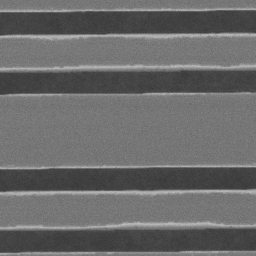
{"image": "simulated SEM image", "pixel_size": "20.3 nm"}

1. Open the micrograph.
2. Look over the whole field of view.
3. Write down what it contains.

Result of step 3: lines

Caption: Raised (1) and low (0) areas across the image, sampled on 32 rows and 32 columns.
11111111111111111111111111111111
00000000000000000000000000000000
00000000000000000000000000000000
00000000000000000000000000000000
01111111111111111111111111111111
11111111111111111111111111111111
11111111111111111111111111111111
11111111111111111111111111111111
11111111111111111111111111111100
00000000000000000000000000000000
00000000000000000000000000000000
00000000000000000000000000000000
11111111111111111111111111111111
11111111111111111111111111111111
11111111111111111111111111111111
11111111111111111111111111111111
11111111111111111111111111111111
11111111111111111111111111111111
11111111111111111111111111111111
11111111111111111111111111111111
11111111111111111111111111111111
00000000000000000000000000000000
00000000000000000000000000000000
00000000000000000000000000000000
11111111111111111111111111111111
11111111111111111111111111111111
11111111111111111111111111111111
11111111111111111111111111111111
11111111111000000000000000000000
00000000000000000000000000000000
00000000000000000000000000000000
00000000000000000000001111111111